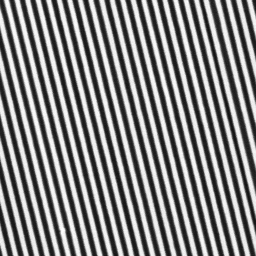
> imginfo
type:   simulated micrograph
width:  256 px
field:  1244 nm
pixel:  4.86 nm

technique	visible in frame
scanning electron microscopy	parallel lines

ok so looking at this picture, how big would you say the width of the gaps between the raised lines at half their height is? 28.9 nm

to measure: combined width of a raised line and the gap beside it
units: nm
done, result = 49.8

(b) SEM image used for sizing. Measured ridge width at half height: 20.7 nanometres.